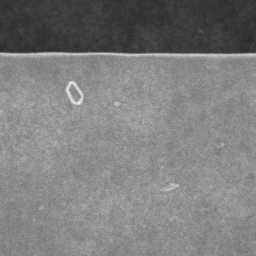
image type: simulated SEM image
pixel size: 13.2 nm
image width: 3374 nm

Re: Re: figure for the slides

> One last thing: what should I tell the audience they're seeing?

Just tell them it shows wiring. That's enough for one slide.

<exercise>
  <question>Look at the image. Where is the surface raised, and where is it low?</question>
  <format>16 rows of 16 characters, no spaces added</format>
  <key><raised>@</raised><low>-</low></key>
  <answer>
----------------
----------------
----------------
@@@@@@@@@@@@@@@@
@@@@@@@@@@@@@@@@
@@@@@@@@@@@@@@@@
@@@@@@@@@@@@@@@@
@@@@@@@@@@@@@@@@
@@@@@@@@@@@@@@@@
@@@@@@@@@@@@@@@@
@@@@@@@@@@@@@@@@
@@@@@@@@@@@@@@@@
@@@@@@@@@@@@@@@@
@@@@@@@@@@@@@@@@
@@@@@@@@@@@@@@@@
@@@@@@@@@@@@@@@@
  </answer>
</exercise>